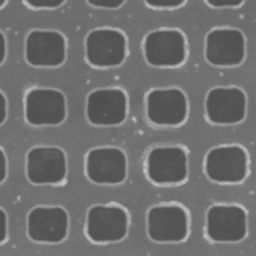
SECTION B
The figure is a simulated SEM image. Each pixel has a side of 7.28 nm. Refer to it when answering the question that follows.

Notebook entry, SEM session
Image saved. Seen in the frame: a regular array of holes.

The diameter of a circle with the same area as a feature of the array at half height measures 296 nanometres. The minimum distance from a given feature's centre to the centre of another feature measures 426 nm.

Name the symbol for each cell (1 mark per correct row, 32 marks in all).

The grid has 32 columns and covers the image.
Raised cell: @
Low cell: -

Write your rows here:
@@@@----@@@----@@@@----@@@----@@
@@@@@@@@@@@@@@@@@@@@@@@@@@@@@@@@
@@@@@@@@@@@@@@@@@@@@@@@@@@@@@@@@
@@@@@@@@@@@@@@@@@@@@@@@@@@@@@@@@
@@@-----@@@----@@@-----@@@----@@
-@@-----@@@-----@@-----@@@-----@
-@@-----@@@-----@@-----@@@-----@
@@@-----@@@----@@@-----@@@----@@
@@@@@@@@@@@@@@@@@@@@@@@@@@@@@@@@
@@@@@@@@@@@@@@@@@@@@@@@@@@@@@@@@
@@@@@@@@@@@@@@@@@@@@@@@@@@@@@@@@
@@@@----@@@----@@@@----@@@----@@
-@@-----@@@-----@@-----@@@-----@
-@@-----@@@-----@@-----@@@-----@
-@@-----@@@-----@@-----@@@-----@
@@@@---@@@@@---@@@@---@@@@@--@@@
@@@@@@@@@@@@@@@@@@@@@@@@@@@@@@@@
@@@@@@@@@@@@@@@@@@@@@@@@@@@@@@@@
@@@@---@@@@@@-@@@@@----@@@@---@@
-@@-----@@@-----@@-----@@@-----@
-@@-----@@@-----@@-----@@@-----@
-@@-----@@@-----@@-----@@@-----@
@@@@----@@@-----@@@----@@@@---@@
@@@@@@@@@@@@@@@@@@@@@@@@@@@@@@@@
@@@@@@@@@@@@@@@@@@@@@@@@@@@@@@@@
@@@@@@@@@@@@@@@@@@@@@@@@@@@@@@@@
@@@@----@@@-----@@@----@@@-----@
-@@------@@-----@@-----@@@-----@
-@@-----@@@-----@@-----@@@-----@
-@@@----@@@-----@@@----@@@-----@
@@@@@@@@@@@@@@@@@@@@@@@@@@@@@@@@
@@@@@@@@@@@@@@@@@@@@@@@@@@@@@@@@